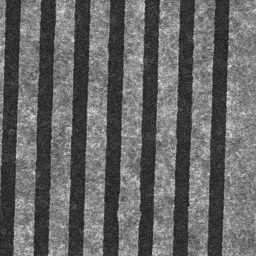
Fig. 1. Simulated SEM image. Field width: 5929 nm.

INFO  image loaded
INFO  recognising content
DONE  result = parallel lines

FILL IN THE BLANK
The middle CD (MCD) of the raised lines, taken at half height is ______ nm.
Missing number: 446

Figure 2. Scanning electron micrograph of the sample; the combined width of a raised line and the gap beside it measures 801 nm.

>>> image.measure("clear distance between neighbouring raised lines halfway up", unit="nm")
359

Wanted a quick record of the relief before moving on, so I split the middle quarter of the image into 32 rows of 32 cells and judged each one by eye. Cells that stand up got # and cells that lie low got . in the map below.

##....#####....#####....####....
##....#####....#####....####....
##....#####....#####....#####...
##....#####....#####....####....
##....#####....#####....####....
##....#####....####.....####....
##....#####....####.....####....
##....#####....####.....####....
##....#####....####.....####....
##....#####....####....#####....
##....####.....####....#####....
##....#####....####....#####....
##....#####....####....#####....
##....#####....####....#####....
##....#####....####....#####....
##....#####....####....#####....
##....#####....####....#####....
##....#####...#####....#####....
##....####....#####....#####....
##....#####....####....#####....
##....####....#####....#####....
##....####.....####....#####....
##....####....#####....#####....
#.....####....#####....#####....
#.....####....#####....#####....
#.....####....#####....#####....
#.....####....#####....#####...#
#.....####....#####....#####....
#....#####....#####....#####....
##...#####....#####....#####...#
##...#####....#####....#####...#
#....#####....#####....#####...#